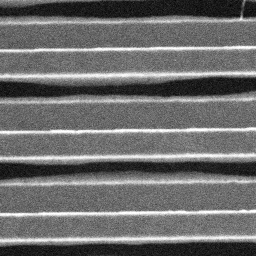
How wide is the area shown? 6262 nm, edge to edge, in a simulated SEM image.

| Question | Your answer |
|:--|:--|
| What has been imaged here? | lines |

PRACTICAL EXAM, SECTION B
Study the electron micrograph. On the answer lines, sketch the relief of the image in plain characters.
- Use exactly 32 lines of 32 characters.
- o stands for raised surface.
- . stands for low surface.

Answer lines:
................................
................................
..............................o.
oooooooooooooooooooooooooooooooo
oooooooooooooooooooooooooooooooo
oooooooooooooooooooooooooooooooo
oooooooooooooooooooooooooooooooo
oooooooooooooooooooooooooooooooo
oooooooooooooooooooooooooooooooo
ooooooooooooooooooooo...........
................................
................................
.............ooooooooooooooooooo
oooooooooooooooooooooooooooooooo
oooooooooooooooooooooooooooooooo
oooooooooooooooooooooooooooooooo
oooooooooooooooooooooooooooooooo
oooooooooooooooooooooooooooooooo
oooooooooooooooooooooooooooooooo
oooooooooooooooooooooooooooooooo
................................
................................
................................
oooooooooooooooooooooooooooooooo
oooooooooooooooooooooooooooooooo
oooooooooooooooooooooooooooooooo
oooooooooooooooooooooooooooooooo
oooooooooooooooooooooooooooooooo
oooooooooooooooooooooooooooooooo
oooooooooooooooooooooooooooooooo
................................
................................